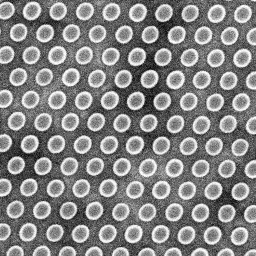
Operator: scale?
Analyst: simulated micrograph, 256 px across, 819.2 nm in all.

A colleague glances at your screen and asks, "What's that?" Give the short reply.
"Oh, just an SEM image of a regular array of raised bodies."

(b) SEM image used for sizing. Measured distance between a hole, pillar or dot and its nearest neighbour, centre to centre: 81.4 nm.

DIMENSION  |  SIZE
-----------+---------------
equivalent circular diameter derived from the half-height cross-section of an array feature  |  51.9 nanometers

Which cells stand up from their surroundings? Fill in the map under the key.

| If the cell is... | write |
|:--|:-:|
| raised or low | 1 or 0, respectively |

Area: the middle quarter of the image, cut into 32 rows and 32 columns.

00000000000000000000000000000000
00000000000000000000000000000000
11110001110001111000111000011000
11110011110001111000111000111100
11100011110001110000111000111100
00000001100000110000110000111000
00000000000000000000000000000000
00001100001110000110000011000000
00011110001110001111000111000011
00011110001110001111000111000111
00011100001110001110000111000111
00000000000000000000000000000000
00000000000000000000000000000000
11100011110001110000111000011000
11100011110001110001111000111100
11100011110001110001111000111100
00000001000001100000110000111000
00000000000000000000000000000000
00001100000110000110000010000000
00011110011110001111000111000011
00011110011110001111000111000111
00011100001110001110000111000111
00000000000000000000000000000011
00000000000000000000000000000000
11100011110001110000110000111000
11100011110001110001111000111100
11100011100001110001111000111000
01000001000001100000110000111000
00000000000000000000000000000000
00011100001100000100000000000000
00011100011110001111000111000111
00011100011110001111001111000111